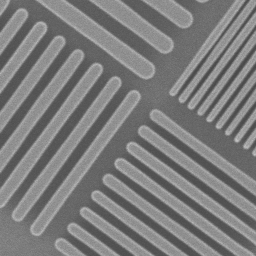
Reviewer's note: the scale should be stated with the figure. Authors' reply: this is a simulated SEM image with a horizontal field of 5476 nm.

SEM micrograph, groups of lines, slits or small figures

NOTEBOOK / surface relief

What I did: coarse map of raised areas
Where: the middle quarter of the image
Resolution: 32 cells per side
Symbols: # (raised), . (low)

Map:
####...##......#######.........#
###...####.......#####........##
##...####.........####........##
#...####....##......#........##.
#...####...###..............##..
...####...####.............##..#
..####....###..............##.##
..####...####...###........#.##.
.####...####...####..........##.
####...####....###...........#..
###....###....####.............#
##....####...####...............
##...####...####......###.......
#....###....###.......####......
....###....####........####.....
...####...####..........#####...
..####...####......###....####..
..###....###.......####....####.
.###....####........####....####
####...####..........#####....##
###....###......###....####....#
##....###.......####....#####...
##...####........#####...#####..
#...####..........#####....####.
....###......###....####....####
...####......####....#####...###
..####........#####...#####....#
..###..........#####....####....
.###......###....####....#####..
####......####....#####...#####.
###........#####...#####....####
##..........#####....####....###